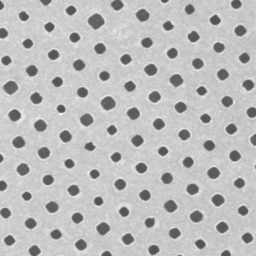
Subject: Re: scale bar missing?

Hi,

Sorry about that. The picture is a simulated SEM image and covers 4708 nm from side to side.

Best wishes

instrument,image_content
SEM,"a regular array of holes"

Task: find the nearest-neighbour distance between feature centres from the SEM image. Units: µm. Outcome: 0.495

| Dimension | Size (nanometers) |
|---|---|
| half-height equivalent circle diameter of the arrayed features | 213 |